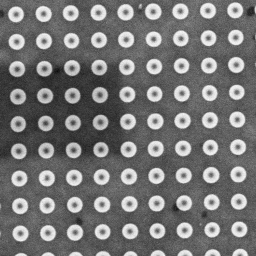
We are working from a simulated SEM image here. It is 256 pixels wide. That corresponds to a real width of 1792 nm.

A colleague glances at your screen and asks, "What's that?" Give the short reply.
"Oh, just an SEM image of an array of small figures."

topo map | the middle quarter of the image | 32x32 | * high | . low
****...****...***....***....***.
****...****...***....***....***.
.**.....**.....*................
................................
................................
................................
.**.....**....***....***....***.
****...****...****...***....***.
****...****...***....***....***.
.**.....**......................
................................
................................
.............................**.
.***....***...****...****...***.
****...****...****...****...***.
.***...****...***....***....***.
................................
................................
................................
......................**.....**.
.***....***...****...****...****
.***....***...****...****...****
.***....***....***....**.....**.
................................
................................
................................
.........*.....**.....**.....**.
.***....***...****...****...****
.***....***...****...****...****
.***....***....***....**.....**.
................................
................................